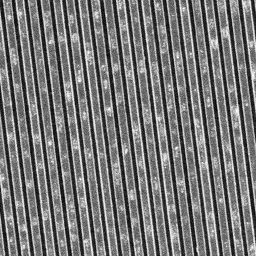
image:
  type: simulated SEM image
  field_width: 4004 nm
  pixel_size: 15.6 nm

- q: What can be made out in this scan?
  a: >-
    parallel lines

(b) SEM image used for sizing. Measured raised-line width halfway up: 122 nm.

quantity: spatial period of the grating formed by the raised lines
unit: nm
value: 195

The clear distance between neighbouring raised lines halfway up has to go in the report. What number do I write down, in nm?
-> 67.9